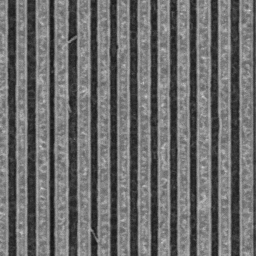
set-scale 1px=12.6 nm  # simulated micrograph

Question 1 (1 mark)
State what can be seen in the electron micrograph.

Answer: parallel lines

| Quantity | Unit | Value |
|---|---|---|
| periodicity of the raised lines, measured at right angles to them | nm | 257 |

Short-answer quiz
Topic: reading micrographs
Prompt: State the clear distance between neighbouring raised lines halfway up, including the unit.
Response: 0.129 microns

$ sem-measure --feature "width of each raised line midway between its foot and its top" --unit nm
140